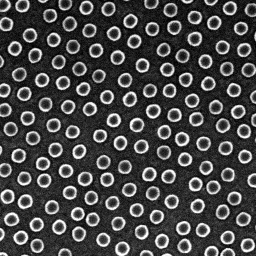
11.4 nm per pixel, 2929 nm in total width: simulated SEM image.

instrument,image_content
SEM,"a regular array of raised bodies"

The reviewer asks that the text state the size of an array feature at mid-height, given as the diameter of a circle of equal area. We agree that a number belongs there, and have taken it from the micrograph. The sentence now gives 151 nanometres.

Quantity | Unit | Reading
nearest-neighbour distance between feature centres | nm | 234